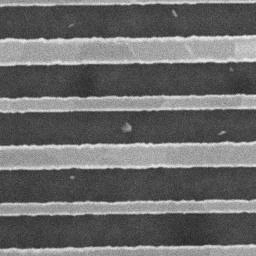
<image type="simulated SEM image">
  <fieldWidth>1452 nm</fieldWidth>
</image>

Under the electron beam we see lines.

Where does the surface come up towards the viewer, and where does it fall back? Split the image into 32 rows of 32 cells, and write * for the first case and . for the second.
******************..............
................................
................................
................................
..............................**
********************************
********************************
********************************
................................
................................
................................
................................
********************************
********************************
................................
................................
................................
................................
********************************
********************************
********************************
................................
................................
................................
................................
********************************
******************************.*
................................
................................
................................
................................
********************************